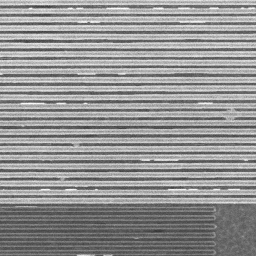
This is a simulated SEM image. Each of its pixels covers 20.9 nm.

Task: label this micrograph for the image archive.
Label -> parallel lines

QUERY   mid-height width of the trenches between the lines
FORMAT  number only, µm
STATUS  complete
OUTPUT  0.0912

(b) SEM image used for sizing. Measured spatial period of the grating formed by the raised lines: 180 nanometers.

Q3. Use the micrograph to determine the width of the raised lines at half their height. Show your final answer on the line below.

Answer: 91.2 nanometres